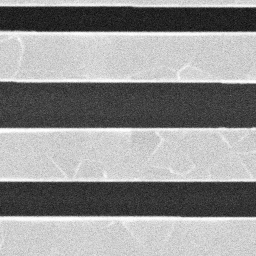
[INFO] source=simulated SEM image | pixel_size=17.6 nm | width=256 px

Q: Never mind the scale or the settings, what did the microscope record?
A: lines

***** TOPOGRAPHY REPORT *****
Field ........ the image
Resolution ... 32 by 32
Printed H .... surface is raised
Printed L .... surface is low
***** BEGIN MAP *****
HHHHHHHHHHHHHHHHHHHHHHHHHHHHHHHH
LLLLLLLLLLLLLLLLLLLLLLLLLLLLLLLL
LLLLLLLLLLLLLLLLLLLLLLLLLLLLLLLL
LLLLLLLLLLLLLLLLLLLLLLLLLLLLLLLL
HHHHHHHHHHHHHHHHHHHHHHHHHHHHHHHH
HHHHHHHHHHHHHHHHHHHHHHHHHHHHHHHH
HHHHHHHHHHHHHHHHHHHHHHHHHHHHHHHH
HHHHHHHHHHHHHHHHHHHHHHHHHHHHHHHH
HHHHHHHHHHHHHHHHHHHHHHHHHHHHHHHH
HHHHHHHHHHHHHHHHHHHHHHHHHHHHHHHH
LLLLLLLLLLLLLLLLLLLLLLLLLLLLLLLL
LLLLLLLLLLLLLLLLLLLLLLLLLLLLLLLL
LLLLLLLLLLLLLLLLLLLLLLLLLLLLLLLL
LLLLLLLLLLLLLLLLLLLLLLLLLLLLLLLL
LLLLLLLLLLLLLLLLLLLLLLLLLLLLLLLL
LLLLLLLLLLLLLLLLLLLLLLLLLLLLLLLL
HHHHHHHHHHHHHHHHHHHHHHHHHHHHHHHH
HHHHHHHHHHHHHHHHHHHHHHHHHHHHHHHH
HHHHHHHHHHHHHHHHHHHHHHHHHHHHHHHH
HHHHHHHHHHHHHHHHHHHHHHHHHHHHHHHH
HHHHHHHHHHHHHHHHHHHHHHHHHHHHHHHH
HHHHHHHHHHHHHHHHHHHHHHHHHHHHHHHH
HHHHHHHHHHHHHHHHHHHHHHHHHHHHHHHH
LLLLLLLLLLLLLLLLLLLLLLLLLLLLLLLL
LLLLLLLLLLLLLLLLLLLLLLLLLLLLLLLL
LLLLLLLLLLLLLLLLLLLLLLLLLLLLLLLL
LLLLLLLLLLLLLLLLLLLLLLLLLLLLLLLL
HHHHHHHHHHHHHHHHHHHHHHHHHHHHHHHH
HHHHHHHHHHHHHHHHHHHHHHHHHHHHHHHH
HHHHHHHHHHHHHHHHHHHHHHHHHHHHHHHH
HHHHHHHHHHHHHHHHHHHHHHHHHHHHHHHH
HHHHHHHHHHHHHHHHHHHHHHHHHHHHHHHH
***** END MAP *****